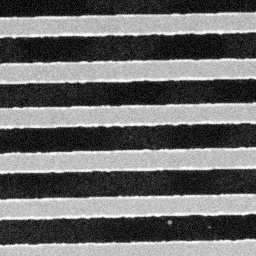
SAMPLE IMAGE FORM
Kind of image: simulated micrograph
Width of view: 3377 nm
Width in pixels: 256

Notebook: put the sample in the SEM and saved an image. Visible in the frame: lines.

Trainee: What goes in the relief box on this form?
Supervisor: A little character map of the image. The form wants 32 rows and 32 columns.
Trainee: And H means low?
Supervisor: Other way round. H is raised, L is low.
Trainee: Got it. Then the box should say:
LLLLLLLLLLLLLLLLLLLLLLLLLLLLLLLL
LLLLLLLLLLLLLLLLLLLLLLLLLLLLLLLL
HHHHHHHHHHHHHHHHHHHHHHHHHHHHHHHH
HHHHHHHHHHHHHHHHHHHHHHHHHHHHHHHH
HHHHHHLLLLLLLLLLLLLLLLLLLLLLLLLL
LLLLLLLLLLLLLLLLLLLLLLLLLLLLLLLL
LLLLLLLLLLLLLLLLLLLLLLLLLLLLLLLL
LLLLLLLLLLLLLLLLLLLLLLLLLLLHHHHH
HHHHHHHHHHHHHHHHHHHHHHHHHHHHHHHH
HHHHHHHHHHHHHHHHHHHHHHHHHHHHHHHH
LLLLLLLLLLLLLLLLLLLLLLLLLLLLLLLL
LLLLLLLLLLLLLLLLLLLLLLLLLLLLLLLL
LLLLLLLLLLLLLLLLLLLLLLLLLLLLLLLL
LLLLLLLLLHHHHHHHHHHHHHHHHHHHHHHH
HHHHHHHHHHHHHHHHHHHHHHHHHHHHHHHH
HHHHHHHHHHHHHHHHHHHHHHHLLLLLLLLL
LLLLLLLLLLLLLLLLLLLLLLLLLLLLLLLL
LLLLLLLLLLLLLLLLLLLLLLLLLLLLLLLL
LLLLLLLLLLLLLLLLLLLLLLLLLLLLLLLL
HHHHHHHHHHHHHHHHHHHHHHHHHHHHHHHH
HHHHHHHHHHHHHHHHHHHHHHHHHHHHHHHH
HLLLLLLLLLLLLLLLLLLLLLLLLLLLLLLL
LLLLLLLLLLLLLLLLLLLLLLLLLLLLLLLL
LLLLLLLLLLLLLLLLLLLLLLLLLLLLLLLL
LLLLLLLLLLLLLLLLLLLLLHHHHHHHHHHH
HHHHHHHHHHHHHHHHHHHHHHHHHHHHHHHH
HHHHHHHHHHHHHHHHHHHHHHHHHHHHHHHH
LLLLLLLLLLLLLLLLLLLLLLLLLLLLLLLL
LLLLLLLLLLLLLLLLLLLLLLLLLLLLLLLL
LLLLLLLLLLLLLLLLLLLLLLLLLLLLLLLL
LLLLLLHHLHHHHHHHHHHHHHHHHHHHHHHH
HHHHHHHHHHHHHHHHHHHHHHHHHHHHHHHH